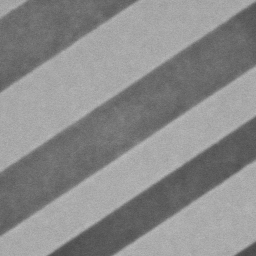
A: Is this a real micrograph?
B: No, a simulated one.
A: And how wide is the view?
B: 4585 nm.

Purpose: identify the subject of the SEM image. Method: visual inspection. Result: lines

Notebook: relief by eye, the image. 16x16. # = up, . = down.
#.......#######.
......########..
.....#######....
...########.....
..#######......#
########......##
######......####
#####......#####
###......#####..
##......#####...
......#####....#
.....#####....##
...#####....####
..#####....#####
#####....#######
####....#######.